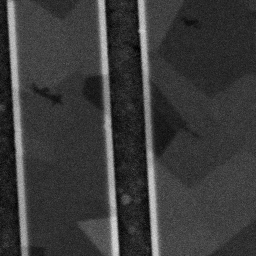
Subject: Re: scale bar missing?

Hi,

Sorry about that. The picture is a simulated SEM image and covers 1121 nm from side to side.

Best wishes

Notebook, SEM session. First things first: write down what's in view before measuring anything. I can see one or a few lines or trenches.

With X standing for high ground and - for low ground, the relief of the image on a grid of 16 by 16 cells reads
-XXXXX---XXXXXXX
-XXXXX---XXXXXXX
-XXXXXX--XXXXXXX
-XXXXXX--XXXXXXX
-XXXXXX--XXXXXXX
-XXXXXX--XXXXXXX
-XXXXXX--XXXXXXX
-XXXXXX--XXXXXXX
-XXXXXX--XXXXXXX
-XXXXXX--XXXXXXX
-XXXXXX--XXXXXXX
-XXXXXX--XXXXXXX
-XXXXXX--XXXXXXX
-XXXXXX---XXXXXX
-XXXXXX---XXXXXX
--XXXXX---XXXXXX